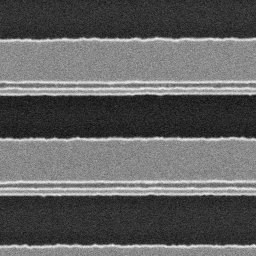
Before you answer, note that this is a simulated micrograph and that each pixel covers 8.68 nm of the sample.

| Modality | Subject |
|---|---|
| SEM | lines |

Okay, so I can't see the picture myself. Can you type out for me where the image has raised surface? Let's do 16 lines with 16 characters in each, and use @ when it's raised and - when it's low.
----------------
----------------
---@@@@-@@@@@@@@
@@@@@@@@@@@@@@@@
@@@@@@@@@@@@@@@@
@@@@@@@@@@@@@@@@
----------------
----------------
----------------
@@@@@@@@@@@@@@@@
@@@@@@@@@@@@@@@@
@@@@@@@@@@@@@@@@
----------------
----------------
----------------
@@@@@@@@@@@@@@@@